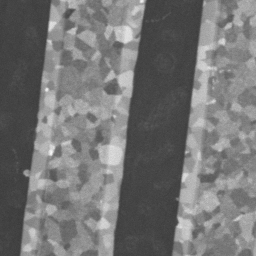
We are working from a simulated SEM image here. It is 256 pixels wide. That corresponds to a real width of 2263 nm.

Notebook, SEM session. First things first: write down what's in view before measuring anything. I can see one or a few lines or trenches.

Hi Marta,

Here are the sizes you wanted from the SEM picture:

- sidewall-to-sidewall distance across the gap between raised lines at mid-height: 676 nm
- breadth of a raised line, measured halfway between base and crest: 659 nm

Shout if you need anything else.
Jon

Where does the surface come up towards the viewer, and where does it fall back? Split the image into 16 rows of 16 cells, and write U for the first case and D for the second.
DDDDUUUUDDDDDUUU
DDDDUUUUDDDDDUUU
DDDUUUUUDDDDDUUU
DDDUUUUUDDDDDUUU
DDDUUUUUDDDDDUUU
DDDUUUUUDDDDDUUU
DDDUUUUUDDDDUUUU
DDDUUUUDDDDDUUUU
DDDUUUUDDDDDUUUU
DDDUUUUDDDDDUUUU
DDUUUUUDDDDDUUUU
DDUUUUUDDDDDUUUU
DDUUUUUDDDDDUUUU
DDUUUUUDDDDDUUUU
DDUUUUUDDDDUUUUU
DDUUUUUDDDDUUUUU